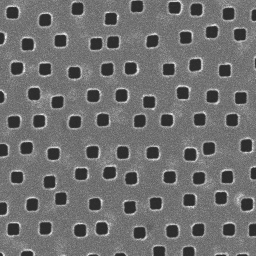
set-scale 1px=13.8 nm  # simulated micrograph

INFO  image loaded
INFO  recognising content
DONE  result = a regular array of holes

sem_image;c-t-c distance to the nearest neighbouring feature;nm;352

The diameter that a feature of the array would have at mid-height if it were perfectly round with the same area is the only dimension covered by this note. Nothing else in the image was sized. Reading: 0.182 microns